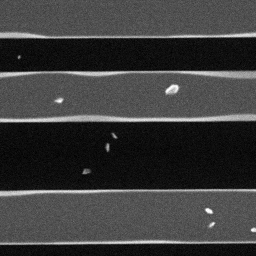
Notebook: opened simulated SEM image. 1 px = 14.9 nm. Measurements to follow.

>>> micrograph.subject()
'groups of lines, slits or small figures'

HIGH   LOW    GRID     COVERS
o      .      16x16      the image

oooooooooooooooo
oooooooooooooooo
................
................
...o....oooo....
oooooooooooooooo
oooooooooooooooo
oooo....oo.o....
................
................
................
................
oooooooooooooooo
oooooooooooooooo
oooooooooooooooo
................